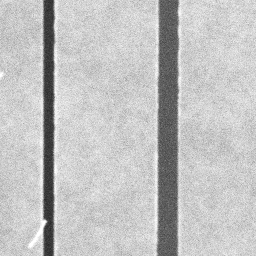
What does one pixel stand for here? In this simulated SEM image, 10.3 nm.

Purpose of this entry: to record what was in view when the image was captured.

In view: lines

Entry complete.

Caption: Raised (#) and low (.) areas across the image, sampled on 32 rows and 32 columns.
#####..#############..##########
#####..#############..##########
#####..#############..##########
#####..#############..##########
#####..#############..##########
#####..#############..##########
#####..#############..##########
#####..#############..##########
#####..#############..##########
#####..#############..##########
#####..#############..##########
#####..#############..##########
#####..#############..##########
#####..#############..##########
#####..#############..##########
#####..#############..##########
#####..#############..##########
#####..#############..##########
#####..#############..##########
#####..#############..##########
#####..#############..##########
#####..#############..##########
#####..#############..##########
#####..#############..##########
#####..#############..##########
#####..#############..##########
#####..#############..##########
######.#############..##########
#####..#############..##########
#####..#############..##########
#####..#############..##########
#####..############...##########